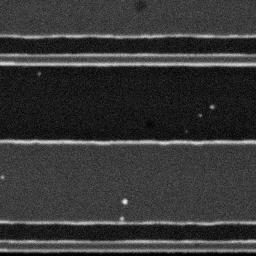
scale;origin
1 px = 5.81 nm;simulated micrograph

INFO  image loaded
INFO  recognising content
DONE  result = lines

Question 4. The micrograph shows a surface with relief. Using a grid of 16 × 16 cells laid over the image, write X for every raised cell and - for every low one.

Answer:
XXXXXXXXXXXXXXXX
XXXXXXXXXXXXXXXX
XXXXXXXXXXXXXXXX
XXXXXXXXXXXXXXXX
----------------
----------------
----------------
----------------
----------------
XXXXXXXXXXXXXXXX
XXXXXXXXXXXXXXXX
XXXXXXXXXXXXXXXX
XXXXXXXXXXXXXXXX
XXXXXXXXXXXXXXXX
XXXXXXXXXXXXXXXX
XXXXXXXXXXXXXXXX